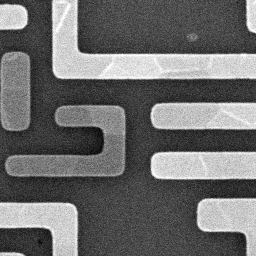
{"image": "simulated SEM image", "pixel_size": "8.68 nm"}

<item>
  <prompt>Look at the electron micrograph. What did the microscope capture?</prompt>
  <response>wiring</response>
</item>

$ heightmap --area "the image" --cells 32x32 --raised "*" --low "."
.......***.....................*
***....***.....................*
***....***.....................*
***....***.....................*
.......***......................
.......***......................
.......***......................
****...*************************
****...*************************
****...*************************
****............................
****............................
****............................
****...********....*************
****...*********...*************
****...*********...*************
.............***................
.............***................
.............***................
............****...*************
.***************...*************
.**************....*************
................................
................................
................................
*********................*******
**********...............*******
**********...............*******
......****...............*******
.......***.....................*
.......***.....................*
.......***.....................*